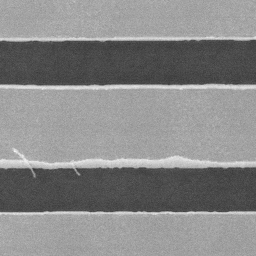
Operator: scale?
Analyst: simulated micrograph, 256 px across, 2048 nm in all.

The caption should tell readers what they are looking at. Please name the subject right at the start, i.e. lines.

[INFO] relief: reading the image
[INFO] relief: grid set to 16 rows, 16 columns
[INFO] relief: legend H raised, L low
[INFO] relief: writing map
HHHHHHHHHHHHHHHH
HHHHHHHHHHHHHHHH
HHHHHLHLLLLLLLLL
LLLLLLLLLLLLLLLL
LLLLLLLLLLLLLLLL
HHHHHHHHHHHHHHHH
HHHHHHHHHHHHHHHH
HHHHHHHHHHHHHHHH
HHHHHHHHHHHHHHHH
HHHHHHHHHHHHHHHH
LLLLLLLLLLLLLLLL
LLLLLLLLLLLLLLLL
LLLLLLLLLLLLLLLL
HHHHHHHHHHHHHHHH
HHHHHHHHHHHHHHHH
HHHHHHHHHHHHHHHH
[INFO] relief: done